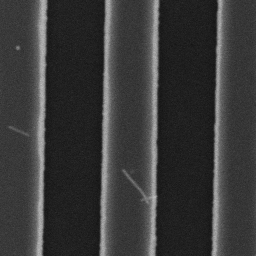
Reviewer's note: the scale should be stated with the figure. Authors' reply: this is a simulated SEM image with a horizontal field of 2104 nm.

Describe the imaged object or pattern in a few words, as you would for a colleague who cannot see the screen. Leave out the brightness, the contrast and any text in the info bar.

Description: lines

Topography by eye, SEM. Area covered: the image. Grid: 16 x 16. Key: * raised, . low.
***....***....**
***....***....**
***....***....**
***....***....**
***....***....**
***....***....**
***...****...***
***...****...***
***...****...***
***...****...***
***...****...***
***...****...***
***...****...***
***...****...***
***...****...***
***...****...***